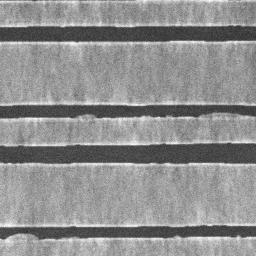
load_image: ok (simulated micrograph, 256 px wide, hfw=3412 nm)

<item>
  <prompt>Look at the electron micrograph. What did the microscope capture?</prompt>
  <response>lines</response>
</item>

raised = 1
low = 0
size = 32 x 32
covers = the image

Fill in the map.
11111111111111111111111111111111
11111111111111111111111111111111
11111111111111111111111111111111
00000000000000000000000000000000
00000000000000000000000000000000
11111111111111111111111111111111
11111111111111111111111111111111
11111111111111111111111111111111
11111111111111111111111111111111
11111111111111111111111111111111
11111111111111111111111111111111
11111111111111111111111111111111
11111111111111111111111111111111
00000000000000000000000000000000
00000000000000000000000000010000
11111111111111111111111111111111
11111111111111111111111111111111
11111111111111111111111111111111
00000000000000000000000000000000
00000000000000000000000000000000
00000000000000000000000000000000
11111111111111111111111111111111
11111111111111111111111111111111
11111111111111111111111111111111
11111111111111111111111111111111
11111111111111111111111111111111
11111111111111111111111111111111
11111111111111111111111111111111
00000000000000000000000000000000
00110000000000000000000000000000
11111111111111111111111111111111
11111111111111111111111111111111